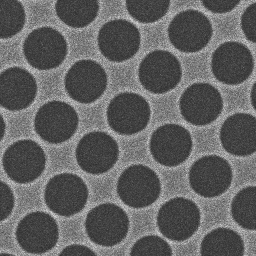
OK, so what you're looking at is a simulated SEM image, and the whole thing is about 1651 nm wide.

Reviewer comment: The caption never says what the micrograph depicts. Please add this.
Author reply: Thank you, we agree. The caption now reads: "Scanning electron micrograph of a regular array of holes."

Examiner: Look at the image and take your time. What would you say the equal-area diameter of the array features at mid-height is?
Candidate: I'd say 282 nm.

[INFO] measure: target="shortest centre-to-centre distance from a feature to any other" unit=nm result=326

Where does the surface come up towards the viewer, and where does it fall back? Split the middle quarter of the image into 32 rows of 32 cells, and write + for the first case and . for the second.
++.......++++++++++..........+++
+.........+++++++++..........+++
+..........+++++++...........+++
...........++++++++..........+++
...........++++++++..........+++
...........+++++++++........+++.
..........+++++++++++......+++..
+.........++++....+++++.++++++..
++.......+++........+++++++++...
+++....++++..........++++++++...
..+++++++++..........++++++++...
...++++++++...........+++++++...
...+++++++............+++++++...
....+++++++...........++++++++..
....+++++++..........++++++++++.
...++++++++..........+++......++
...+++++++++........+++........+
..+++......+++....++++..........
..++........++++++++++..........
++++.........++++++++...........
+++...........+++++++...........
+++...........+++++++...........
+++...........++++++++.........+
+++...........++++++++.........+
+++..........++++++++++.......++
++++........++++.....++++...++++
+++++.......+++.......+++++++++.
..+++++..+++++.........++++++++.
....++++++++++..........+++++++.
.....++++++++...........+++++++.
......+++++++...........++++++++
......+++++++...........++++++++